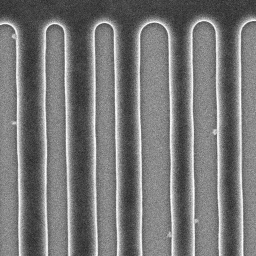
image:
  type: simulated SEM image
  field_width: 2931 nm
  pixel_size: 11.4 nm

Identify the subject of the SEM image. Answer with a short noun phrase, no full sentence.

groups of lines, slits or small figures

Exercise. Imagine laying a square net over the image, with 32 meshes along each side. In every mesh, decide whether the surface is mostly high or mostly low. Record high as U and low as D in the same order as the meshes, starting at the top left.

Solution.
UUUUUUUUUUUUUUUUUUUUUUUUUUUUUUUU
UUUUUUUUUUUUUUUUUUUUUUUUUUUUUUUU
UUUUUUUUUUUUUUUUUUUUUUUUUUUUUUUU
DDUUUUDDUUUUDDUUUUDDDUUUDDDUUUDD
DDUUUUDDUUUUDDUUUDDDDUUUDDDUUUDD
DDUUUUDDUUUUDDUUUDDDDUUUDDDUUUDD
DDUUUUDDUUUUDDUUUDDDDUUUDDDUUUDD
DDUUUUDDUUUUDDUUUDDDDUUUDDDUUUDD
DDUUUUDDUUUUDDUUUDDDDUUUDDDUUUDD
DDUUUUDDUUUUDDUUUDDDDUUUDDDUUUDD
DDUUUUDDUUUUDDUUUDDDDUUUDDDUUUDD
DDUUUUDDUUUUDDDUUDDDDUUUDDDUUUDD
DDUUUUDDUUUUDDDUUDDDDUUUDDDUUUDD
DDUUUUDDUUUUDDDUUDDDDUUUDDDUUUDD
DDUUUUDDUUUUDDDUUDDDDUUUDDDUUUDD
DDUUUUDDUUUUDDDUUDDDDUUUDDDUUUDD
DDUUUUDDUUUUDDDUUUDDDUUUDDDUUUDD
DDUUUUDDUUUUDDDUUUDDDUUUDDDUUUDD
DDUUUUDDUUUUDDDUUUDDDUUUDDDUUUDD
DDUUUUDDUUUUDDDUUUDDDUUUDDDUUUDD
DDUUUUDDUUUUDDDUUUDDDUUUDDDUUUDD
DDUUUUDDUUUUDDDUUUDDDUUUDDDUUUDD
DDUUUUDDDUUUDDDUUUDDDUUUDDDUUUDD
DDUUUUDDDUUUDDDUUUDDDUUUDDDUUUDD
DDUUUUDDDUUUDDDUUUDDDUUUDDDUUUDD
DDUUUUDDDUUUDDDUUUDDDUUUDDDUUUDD
DDUUUUDDDUUUDDDUUUDDDUUUDDDUUUDD
DDUUUUDDDUUUDDDUUUDDDDUUDDDUUUDD
DDUUUUDDDUUUDDDUUUDDDDUUDDDUUUDD
DDUUUUDDDUUUDDDUUUDDDUUUDDDUUUDD
DDUUUUDDDUUUDDDUUUDDDDUUDDDUUUDD
DDUUUUDDDUUUDDDUUUDDDDUUDDDUUUDD